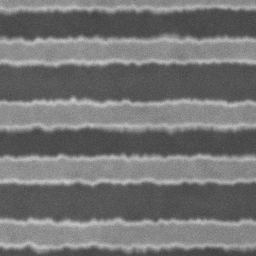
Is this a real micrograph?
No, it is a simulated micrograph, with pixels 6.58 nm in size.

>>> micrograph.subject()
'lines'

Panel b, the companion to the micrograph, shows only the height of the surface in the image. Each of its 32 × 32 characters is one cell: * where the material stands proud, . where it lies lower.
********************************
................................
................................
................................
................................
********************************
********************************
********************************
................................
................................
................................
................................
................................
********************************
********************************
********************************
................................
................................
................................
................................
********************************
********************************
******************.*************
................................
................................
................................
................................
................................
********************************
********************************
********************************
................................